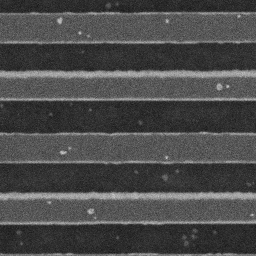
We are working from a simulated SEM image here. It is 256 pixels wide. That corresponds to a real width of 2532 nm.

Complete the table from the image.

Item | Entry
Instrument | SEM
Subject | lines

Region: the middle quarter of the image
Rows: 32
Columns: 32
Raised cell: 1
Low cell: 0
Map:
00000000000000000000000000000000
00000000000000000000000000000000
11111111111111111111111111111111
11111111111111111111111111111111
11111111111111111111111111111111
11111111111111111111111111111111
11111111111111111111111111111111
11111111111111111111111111111111
11111111111111111111111111111111
00000000000000000000000000000000
00000000000000000000000000000000
00000000000000000000000000000000
00000000000000000000000000000000
00000000000000000000000000000000
00000000000000000000000000000000
00000000000000000000000000000000
00000000000000000000000000000000
11111111111011111111111111111111
11111111111111111111111111111111
11111111111111111111111111111111
11111111111111111111111111111111
11111111111111111111111111111111
11111111111111111111111111111111
11111111111111111111111111111111
11111111111111111111111111111111
00000000000000000000000000000000
00000000000000000000000000000000
00000000000000000000000000000000
00000000000000000000000000000000
00000000000000000000000000000000
00000000000000000000000000000000
00000000000000000000000000000000